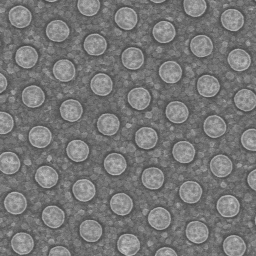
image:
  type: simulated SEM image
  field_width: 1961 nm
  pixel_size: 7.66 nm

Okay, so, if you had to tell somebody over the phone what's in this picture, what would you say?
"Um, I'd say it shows a regular array of raised bodies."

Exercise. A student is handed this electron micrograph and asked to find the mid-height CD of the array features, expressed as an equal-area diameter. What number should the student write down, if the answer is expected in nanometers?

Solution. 166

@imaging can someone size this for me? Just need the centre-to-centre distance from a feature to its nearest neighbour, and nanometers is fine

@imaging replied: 306